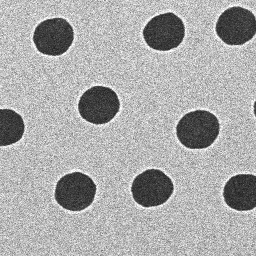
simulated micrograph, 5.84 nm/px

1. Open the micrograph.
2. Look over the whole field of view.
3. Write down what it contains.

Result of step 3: holes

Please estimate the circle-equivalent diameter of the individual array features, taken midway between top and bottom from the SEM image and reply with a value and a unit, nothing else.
232 nm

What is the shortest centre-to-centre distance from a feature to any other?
464 nm